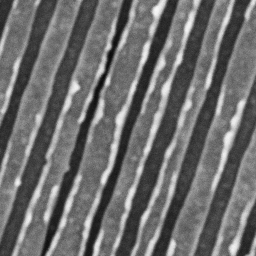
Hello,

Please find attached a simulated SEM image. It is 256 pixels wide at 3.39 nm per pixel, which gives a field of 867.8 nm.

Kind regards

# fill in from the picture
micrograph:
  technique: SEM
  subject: parallel lines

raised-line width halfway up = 77.2 nanometers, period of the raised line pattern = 0.127 µm